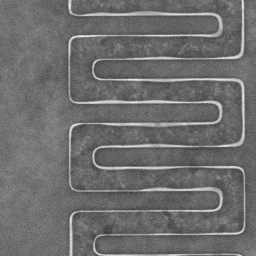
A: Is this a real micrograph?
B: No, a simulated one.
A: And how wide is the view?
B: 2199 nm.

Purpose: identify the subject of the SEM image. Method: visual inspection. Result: groups of lines, slits or small figures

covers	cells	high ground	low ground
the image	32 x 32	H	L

LLLLLLLLLHHHHHHHHHHHHHHHHHHHHHLL
LLLLLLLLLHHHHHHHHHHHHHHHHHHHHHLL
LLLLLLLLLLLLLLLLLLLLLLLLLLLHHHLL
LLLLLLLLLLLLLLLLLLLLLLLLLLLLHHLL
LLLLLLLLLLLLHHHHHHHHHHHHHHHHHHLL
LLLLLLLLLHHHHHHHHHHHHHHHHHHHHHLL
LLLLLLLLLHHHHHHHHHHHHHHHHHHHHHLL
LLLLLLLLLHHHHLLLLLLLLLLLLLLLLLLL
LLLLLLLLLHHHLLLLLLLLLLLLLLLLLLLL
LLLLLLLLLHHHLLLLLLLLLLLLLLLLLLLL
LLLLLLLLLHHHHHHHHHHHHHHHHHHHHHLL
LLLLLLLLLHHHHHHHHHHHHHHHHHHHHHLL
LLLLLLLLLHHHHHHHHHHHHHHHHHHHHHLL
LLLLLLLLLLLLLLLLLLLLLLLLLLLLHHLL
LLLLLLLLLLLLLLLLLLLLLLLLLLLLHHLL
LLLLLLLLLLHHHLLLLLLLLLLLHHHHHHLL
LLLLLLLLLHHHHHHHHHHHHHHHHHHHHHLL
LLLLLLLLLHHHHHHHHHHHHHHHHHHHHHLL
LLLLLLLLLHHHLLLLLLLLLLLLLLLLLLLL
LLLLLLLLLHHHLLLLLLLLLLLLLLLLLLLL
LLLLLLLLLHHHLLLLLLLLLLLLLLLLLLLL
LLLLLLLLLHHHHHHHHHHHHHHHHHHHHHLL
LLLLLLLLLHHHHHHHHHHHHHHHHHHHHHHL
LLLLLLLLLHHHHHHHHHHHHHHHHHHHHHHL
LLLLLLLLLLLLLLLLLLLLLLLLLLLLHHHL
LLLLLLLLLLLLLLLLLLLLLLLLLLLLHHHL
LLLLLLLLLHHHHHHHHHHHHHHHHHHHHHHL
LLLLLLLLLHHHHHHHHHHHHHHHHHHHHHHL
LLLLLLLLLHHHHHHHHHHHHHHHHHHHHHLL
LLLLLLLLLHHHHLLLLLLLLLLLLLLLLLLL
LLLLLLLLLHHHLLLLLLLLLLLLLLLLLLLL
LLLLLLLLLHHHLLLLLLLLLLLLLLLLLLLL